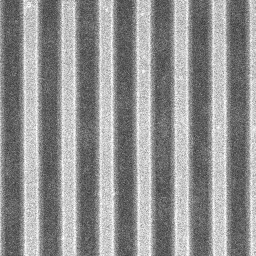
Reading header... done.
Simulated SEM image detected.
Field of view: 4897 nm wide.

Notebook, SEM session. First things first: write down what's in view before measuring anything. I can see parallel lines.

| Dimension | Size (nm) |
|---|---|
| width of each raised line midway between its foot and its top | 311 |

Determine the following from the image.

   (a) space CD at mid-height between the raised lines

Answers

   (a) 411 nm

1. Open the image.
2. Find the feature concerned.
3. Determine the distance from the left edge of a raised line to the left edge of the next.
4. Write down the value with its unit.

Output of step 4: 720 nm